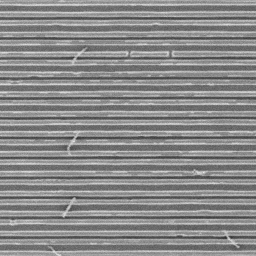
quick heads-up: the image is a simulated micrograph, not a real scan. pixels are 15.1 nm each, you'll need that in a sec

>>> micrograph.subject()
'parallel lines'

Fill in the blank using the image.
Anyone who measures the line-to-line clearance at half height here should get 104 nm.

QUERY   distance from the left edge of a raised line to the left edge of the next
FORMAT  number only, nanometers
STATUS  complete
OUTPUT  149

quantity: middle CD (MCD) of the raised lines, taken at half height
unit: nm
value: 60.2